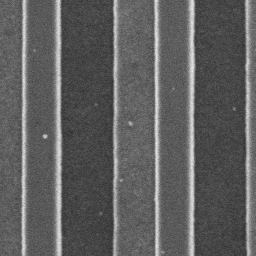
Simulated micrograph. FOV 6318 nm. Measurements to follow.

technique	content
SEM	lines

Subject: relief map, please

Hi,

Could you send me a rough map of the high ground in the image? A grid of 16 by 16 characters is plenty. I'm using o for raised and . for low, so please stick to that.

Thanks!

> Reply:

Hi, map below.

oooo...ooooo...o
oooo...ooooo...o
oooo...ooooo...o
oooo...ooooo...o
oooo...ooooo...o
oooo...ooooo...o
oooo...ooooo...o
oooo...ooooo...o
oooo...ooooo...o
oooo...ooooo...o
oooo...ooooo...o
oooo...ooooo....
oooo...ooooo....
oooo...ooooo....
oooo...ooooo....
oooo...ooooo....